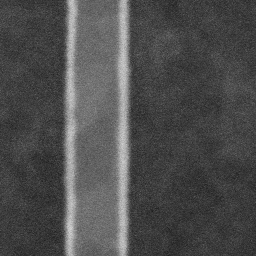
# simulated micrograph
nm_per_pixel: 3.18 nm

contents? one or a few lines or trenches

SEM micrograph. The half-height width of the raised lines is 167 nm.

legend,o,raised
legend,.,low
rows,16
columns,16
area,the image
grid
.....ooo........
.....ooo........
....oooo........
....oooo........
....oooo........
....oooo........
....oooo........
....oooo........
....oooo........
....oooo........
....oooo........
....oooo........
....oooo........
....oooo........
....oooo........
....oooo........